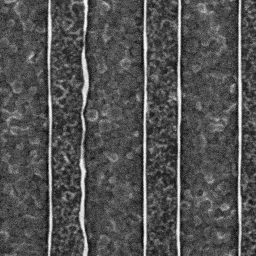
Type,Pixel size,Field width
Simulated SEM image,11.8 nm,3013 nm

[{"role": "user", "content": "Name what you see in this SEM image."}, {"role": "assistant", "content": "one or a few lines or trenches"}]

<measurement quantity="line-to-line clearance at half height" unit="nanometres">718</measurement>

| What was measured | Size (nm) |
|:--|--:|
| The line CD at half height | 399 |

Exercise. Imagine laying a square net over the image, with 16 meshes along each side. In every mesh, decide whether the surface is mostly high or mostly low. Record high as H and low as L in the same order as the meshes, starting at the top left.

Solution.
LLLHHLLLLHHLLLLH
LLLHHLLLLHHLLLLH
LLLHHLLLLHHLLLLH
LLLHHLLLLHHLLLLH
LLLHHLLLLHHLLLLH
LLLHHLLLLHHLLLLH
LLLHHLLLLHHLLLLH
LLLHHLLLLHHLLLLH
LLLHHLLLLHHLLLLH
LLLHHLLLLHHLLLLH
LLLHHLLLLHHLLLLH
LLLHHLLLLHHLLLLH
LLLHHLLLLHHLLLLH
LLLHHLLLLHHLLLLH
LLLHHLLLLHHLLLLH
LLLHHLLLLHHLLLLH